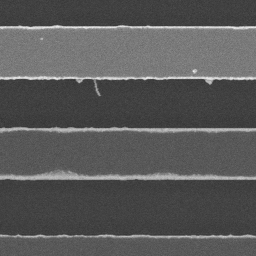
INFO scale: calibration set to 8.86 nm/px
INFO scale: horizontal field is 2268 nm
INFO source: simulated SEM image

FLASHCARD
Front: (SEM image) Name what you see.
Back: lines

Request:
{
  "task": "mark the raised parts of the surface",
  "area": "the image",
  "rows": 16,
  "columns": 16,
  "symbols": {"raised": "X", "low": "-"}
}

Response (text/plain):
----------------
----------------
XXXXXXXXXXXXXXXX
XXXXXXXXXXXXXXXX
XXXXXXXXXXXXXXXX
----------------
----------------
----------------
XXXXXXXXXXXXXXXX
XXXXXXXXXXXXXXXX
XXXXXXXXXXXXXXXX
----------------
----------------
----------------
----------------
XXXXXXXXXXXXXXXX